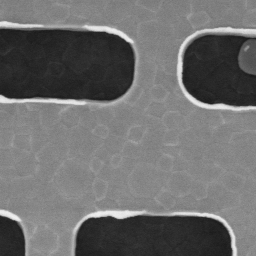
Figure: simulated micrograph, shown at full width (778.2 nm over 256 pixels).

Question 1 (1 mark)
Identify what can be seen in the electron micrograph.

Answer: holes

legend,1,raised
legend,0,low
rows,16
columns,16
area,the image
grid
1111111111111111
1111111111111111
0000000011110000
0000000011100000
0000000011100000
0000000011110000
1111111111111100
1111111111111111
1111111111111111
1111111111111111
1111111111111111
1111111111111111
1111111111111111
1111111110001111
0111100000000011
0011100000000011